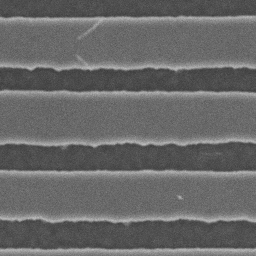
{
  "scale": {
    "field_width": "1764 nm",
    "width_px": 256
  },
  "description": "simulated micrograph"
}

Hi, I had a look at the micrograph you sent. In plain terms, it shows lines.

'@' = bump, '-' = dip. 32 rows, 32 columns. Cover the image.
--------------------------------
--------------------------------
@@@@@@@@@@@@@@@@@@@@@@@@@@@@@@@@
@@@@@@@@@@@@@@@@@@@@@@@@@@@@@@@@
@@@@@@@@@@@@@@@@@@@@@@@@@@@@@@@@
@@@@@@@@@@@@@@@@@@@@@@@@@@@@@@@@
@@@@@@@@@@@@@@@@@@@@@@@@@@@@@@@@
@@@@@@@@@@@@@@@@@@@@@@@@@@@@@@@@
---@--@@@@@@@@@@@@-@@@@@@------@
--------------------------------
--------------------------------
@@@@@@@@@@-@@@@@@@@@@@@-@@@@-@--
@@@@@@@@@@@@@@@@@@@@@@@@@@@@@@@@
@@@@@@@@@@@@@@@@@@@@@@@@@@@@@@@@
@@@@@@@@@@@@@@@@@@@@@@@@@@@@@@@@
@@@@@@@@@@@@@@@@@@@@@@@@@@@@@@@@
@@@@@@@@@@@@@@@@@@@@@@@@@@@@@@@@
@@@@@@@@@@@@@@@@@@@@@@@@@@@@@@@@
--------------------------------
--------------------------------
--------------------------------
@@@@@@@@@@@@@@@@@@@@@@@@@@@--@@@
@@@@@@@@@@@@@@@@@@@@@@@@@@@@@@@@
@@@@@@@@@@@@@@@@@@@@@@@@@@@@@@@@
@@@@@@@@@@@@@@@@@@@@@@@@@@@@@@@@
@@@@@@@@@@@@@@@@@@@@@@@@@@@@@@@@
@@@@@@@@@@@@@@@@@@@@@@@@@@@@@@@@
--@---@@@@@@@@@@@@@-@----@@@@--@
--------------------------------
--------------------------------
--------------------------------
@@@@@@@@@@@@@@@@@@@@@@@@@@@@@@@@